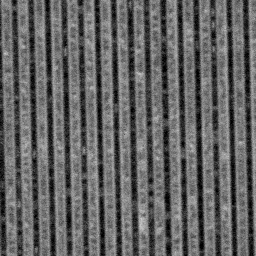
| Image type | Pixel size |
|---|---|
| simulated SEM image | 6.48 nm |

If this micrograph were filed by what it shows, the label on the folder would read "parallel lines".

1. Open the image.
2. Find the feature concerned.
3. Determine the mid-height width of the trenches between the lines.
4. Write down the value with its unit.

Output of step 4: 7.24 px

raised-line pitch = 16.5 pixels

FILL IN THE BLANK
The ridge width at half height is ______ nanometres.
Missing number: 58.3